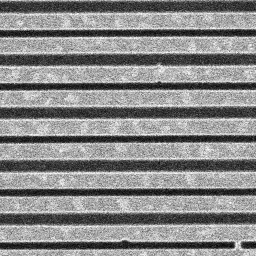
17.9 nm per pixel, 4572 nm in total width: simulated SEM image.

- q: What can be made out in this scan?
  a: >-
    parallel lines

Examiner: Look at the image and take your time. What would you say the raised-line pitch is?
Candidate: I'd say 474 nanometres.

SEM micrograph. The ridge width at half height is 308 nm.